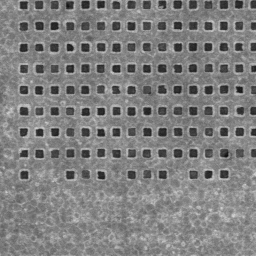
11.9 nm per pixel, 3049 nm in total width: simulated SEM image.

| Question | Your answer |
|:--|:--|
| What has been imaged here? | a regular array of holes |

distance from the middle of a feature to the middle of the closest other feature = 0.18 micrometres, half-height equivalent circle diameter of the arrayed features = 110 nanometres